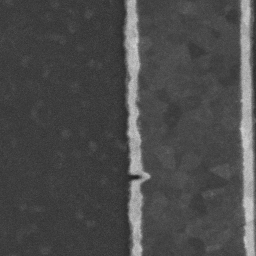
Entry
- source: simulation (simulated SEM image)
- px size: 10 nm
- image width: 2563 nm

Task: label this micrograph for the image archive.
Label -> one or a few lines or trenches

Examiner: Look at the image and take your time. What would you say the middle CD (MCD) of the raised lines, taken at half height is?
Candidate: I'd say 1130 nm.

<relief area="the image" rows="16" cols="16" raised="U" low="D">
DDDDDDDDUUUUUUUD
DDDDDDDDUUUUUUUD
DDDDDDDDUUUUUUUD
DDDDDDDDUUUUUUUD
DDDDDDDDUUUUUUUD
DDDDDDDDUUUUUUUD
DDDDDDDDUUUUUUUD
DDDDDDDDUUUUUUUD
DDDDDDDDUUUUUUUD
DDDDDDDDUUUUUUUU
DDDDDDDDUUUUUUUU
DDDDDDDDDUUUUUUU
DDDDDDDDUUUUUUUU
DDDDDDDDUUUUUUUU
DDDDDDDDUUUUUUUU
DDDDDDDDDUUUUUUU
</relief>